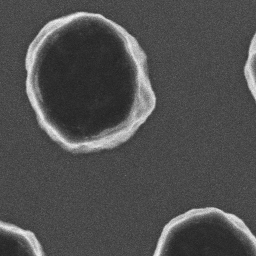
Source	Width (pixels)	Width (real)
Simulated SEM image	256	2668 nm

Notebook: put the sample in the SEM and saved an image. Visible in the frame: raised bodies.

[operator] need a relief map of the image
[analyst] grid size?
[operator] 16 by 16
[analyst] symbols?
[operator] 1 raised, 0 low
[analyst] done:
0000000000000000
0001111000000000
0011111100000000
0011111110000000
0011111110000000
0011111110000000
0011111110000000
0001111110000000
0000111100000000
0000000000000000
0000000000000000
0000000000000000
0000000000000000
0000000000011100
1000000000111111
1100000000111111